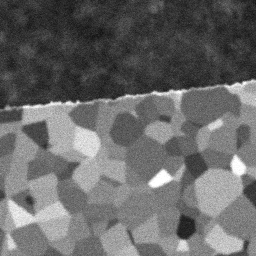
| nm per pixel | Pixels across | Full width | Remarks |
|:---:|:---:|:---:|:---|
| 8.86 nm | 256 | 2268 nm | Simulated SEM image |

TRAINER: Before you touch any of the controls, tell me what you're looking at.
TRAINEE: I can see one or a few lines or trenches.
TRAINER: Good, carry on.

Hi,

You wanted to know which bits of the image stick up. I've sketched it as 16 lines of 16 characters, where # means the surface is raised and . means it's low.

................
................
................
................
................
.............###
...#############
################
################
################
################
################
################
################
################
################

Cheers